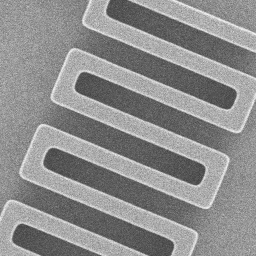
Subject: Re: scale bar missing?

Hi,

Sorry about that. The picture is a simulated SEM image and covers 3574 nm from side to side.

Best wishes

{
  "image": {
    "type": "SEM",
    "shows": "groups of lines, slits or small figures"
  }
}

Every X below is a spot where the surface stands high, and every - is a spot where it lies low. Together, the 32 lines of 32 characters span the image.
-----------XXX---XXXXXX---------
-----------XX-------XXXXX-------
----------XXXX--------XXXXXX----
-----------XXXXXX-------XXXXXX--
-------------XXXXXX--------XXXXX
----------------XXXXXX-------XXX
---------XX-------XXXXXX--------
--------XXXXX--------XXXXX------
--------XXXXXXX--------XXXXXX---
-------XXX--XXXXXX--------XXXXX-
-------XX------XXXXX--------XXXX
-------XXX-------XXXXXX-------XX
-------XXXXX-------XXXXXX----XXX
--------XXXXXX--------XXXXXX-XX-
-----------XXXXXX-------XXXXXXX-
-------------XXXXXX--------XXXX-
----XXXX--------XXXXX--------X--
----XXXXXX--------XXXXXX--------
----XXXXXXXXX-------XXXXXX------
---XXX----XXXXX--------XXXXX----
---XX-------XXXXXX-------XXXX---
---XXXX-------XXXXXX------XX----
---XXXXXX--------XXXXXX--XXX----
------XXXXX--------XXXXXXXX-----
--------XXXXXX--------XXXXX-----
-XX--------XXXXX--------XX------
XXXXX--------XXXXXX-------------
XXXXXXXX-------XXXXXX-----------
XX--XXXXXX--------XXXXXX--------
XX-----XXXXXX-------XXXXX-------
XX-------XXXXXX-------XX--------
XXXX--------XXXXX-----XX--------